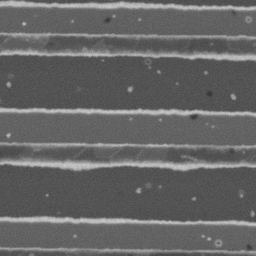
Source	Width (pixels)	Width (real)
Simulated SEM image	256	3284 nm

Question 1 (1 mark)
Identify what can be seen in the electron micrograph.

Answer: lines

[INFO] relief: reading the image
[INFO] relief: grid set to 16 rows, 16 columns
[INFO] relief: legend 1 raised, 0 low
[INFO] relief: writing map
1111111111111110
1111111111111111
1111111111111111
0000000000000111
0000000000000000
0000000000000000
0000000000000000
1111111111111111
1111111111111111
1111111111111111
0000000000000000
0000000000000000
0000000000000000
0000000000000000
1111111111111111
1111111111111111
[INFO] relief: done